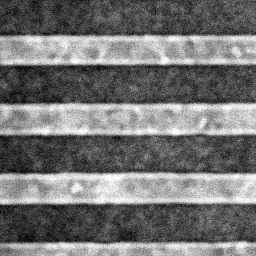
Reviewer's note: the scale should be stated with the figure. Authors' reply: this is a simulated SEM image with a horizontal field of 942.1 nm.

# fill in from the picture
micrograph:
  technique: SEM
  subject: one or a few lines or trenches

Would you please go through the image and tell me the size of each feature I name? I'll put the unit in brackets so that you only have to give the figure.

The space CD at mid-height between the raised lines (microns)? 0.16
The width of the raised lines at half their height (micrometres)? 0.0934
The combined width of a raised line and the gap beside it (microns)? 0.255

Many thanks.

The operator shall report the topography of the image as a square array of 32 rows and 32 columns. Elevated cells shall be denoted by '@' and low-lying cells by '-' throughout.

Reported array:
--------------------------------
--------------------------------
--------------------------------
--------------------------------
--------------------------------
@@@@@@@@@@@@@@@@@@@@@@@@@@@@@@@@
@@@@@@@@@@@@@@@@@@@@@@@@@@@@@@@@
@@@@@@@@@@@@@@@@@@@@@@@@@@@@@@@@
--------------------------------
--------------------------------
--------------------------------
--------------------------------
--------------------------------
@@@@@@@@@@@@@@@@@@@@@@@@@@@@@@@@
@@@@@@@@@@@@@@@@@@@@@@@@@@@@@@@@
@@@@@@@@@@@@@@@@@@@@@@@@@@@@@@@@
@@@@@@@@@@@@@@@@@@@@@@@@@@@@@@@@
--------------------------------
--------------------------------
--------------------------------
--------------------------------
--------------------------------
@@@@@@@@@@@@@@@@@@@@@@@@@@@@@@@@
@@@@@@@@@@@@@@@@@@@@@@@@@@@@@@@@
@@@@@@@@@@@@@@@@@@@@@@@@@@@@@@@@
--------------------------------
--------------------------------
--------------------------------
--------------------------------
--------------------------------
--------------------------------
@@@@@@@@@@@@@@@@@@@@@@@@@@@@@@@@